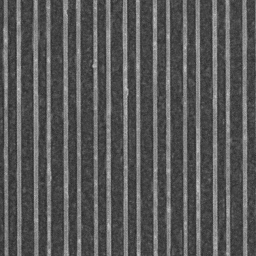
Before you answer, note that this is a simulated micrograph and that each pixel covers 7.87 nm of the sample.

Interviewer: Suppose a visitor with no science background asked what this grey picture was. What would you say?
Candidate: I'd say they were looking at parallel lines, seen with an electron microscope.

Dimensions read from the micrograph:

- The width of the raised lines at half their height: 3.49 pixels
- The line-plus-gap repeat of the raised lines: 117 nanometers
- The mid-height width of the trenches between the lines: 77.7 nm